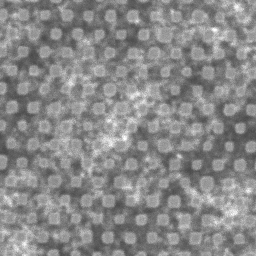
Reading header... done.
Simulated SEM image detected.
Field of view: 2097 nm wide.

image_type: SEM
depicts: a regular array of raised bodies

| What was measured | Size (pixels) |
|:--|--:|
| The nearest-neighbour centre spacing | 21.2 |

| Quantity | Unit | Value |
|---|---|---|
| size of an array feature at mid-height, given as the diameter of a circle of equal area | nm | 85.7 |